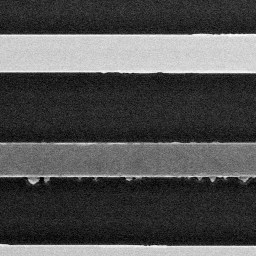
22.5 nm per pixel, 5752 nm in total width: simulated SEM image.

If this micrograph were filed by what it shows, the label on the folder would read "lines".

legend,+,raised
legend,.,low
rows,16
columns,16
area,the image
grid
................
................
++++++++++++++++
++++++++++++++++
......++++++++++
................
................
................
................
++++++++++++++++
++++++++++++++++
................
................
................
................
++++++++++++++++